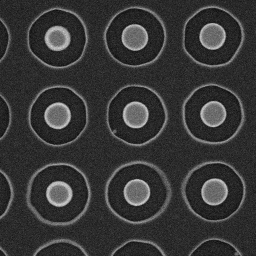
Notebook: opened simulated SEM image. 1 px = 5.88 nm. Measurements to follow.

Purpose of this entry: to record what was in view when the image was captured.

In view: an array of small figures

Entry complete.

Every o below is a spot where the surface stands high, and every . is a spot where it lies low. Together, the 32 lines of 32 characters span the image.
oooooooooooooooooooooooooooooooo
oooooo...oooooo....oooooo...oooo
ooooo.....oooo......oooo......oo
.ooo...o...oo...oo..ooo..ooo..oo
.ooo..ooo..oo..ooo...oo..ooo..oo
.ooo..oo...oo...oo..ooo..ooo..oo
.ooo......oooo......ooo.......oo
ooooo.....ooooo....ooooo.....ooo
oooooooooooooooooooooooooooooooo
oooooooooooooooooooooooooooooooo
oooooooooooooooooooooooooooooooo
ooooo....oooooo....ooooo.....ooo
oooo......oooo......ooo.......oo
.ooo..oo...ooo..oo...oo..ooo..oo
.ooo..ooo..oo...oo...oo..ooo..oo
.ooo..oo...ooo..oo..ooo...oo..oo
.ooo......oooo......oooo.....ooo
ooooo....oooooo....oooooo...oooo
oooooooooooooooooooooooooooooooo
oooooooooooooooooooooooooooooooo
ooooooo.oooooooo..oooooooo..oooo
ooooo.....oooo......oooo.....ooo
.ooo.......ooo..oo...oo...oo..oo
.ooo..ooo..oo...ooo..oo..ooo...o
.ooo..ooo..oo...ooo..oo..ooo..oo
.ooo...o...ooo...o...oo...o...oo
.oooo.....oooo......oooo.....ooo
oooooo...ooooooo...ooooooo.ooooo
oooooooooooooooooooooooooooooooo
oooooooooooooooooooooooooooooooo
oooooo...ooooooo...oooooo...oooo
ooooo......ooo......oooo......oo